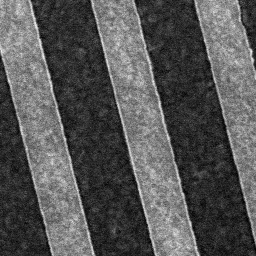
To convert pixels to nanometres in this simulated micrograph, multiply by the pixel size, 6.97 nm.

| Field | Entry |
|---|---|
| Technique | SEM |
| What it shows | one or a few lines or trenches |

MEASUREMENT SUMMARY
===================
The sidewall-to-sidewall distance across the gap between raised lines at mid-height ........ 414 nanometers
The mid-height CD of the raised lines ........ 284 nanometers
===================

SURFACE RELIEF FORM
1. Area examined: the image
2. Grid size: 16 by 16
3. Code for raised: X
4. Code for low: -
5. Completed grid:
XX----XX----XXX-
XX----XXX----XX-
XX----XXX----XX-
XXX----XX----XXX
XXX----XX----XXX
-XX----XXX----XX
-XX----XXX----XX
-XXX----XX----XX
-XXX----XX----XX
--XX----XXX----X
--XX----XXX----X
--XXX----XX----X
--XXX----XXX---X
---XX----XXX----
---XX----XXX----
---XXX----XX----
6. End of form